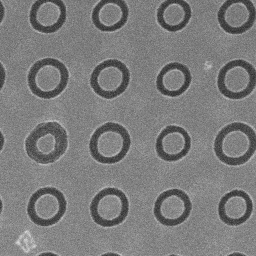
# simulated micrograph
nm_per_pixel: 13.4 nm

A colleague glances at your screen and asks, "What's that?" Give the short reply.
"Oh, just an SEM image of a regular array of ring-shaped grooves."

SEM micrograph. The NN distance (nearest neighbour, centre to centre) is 842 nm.